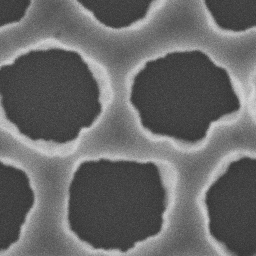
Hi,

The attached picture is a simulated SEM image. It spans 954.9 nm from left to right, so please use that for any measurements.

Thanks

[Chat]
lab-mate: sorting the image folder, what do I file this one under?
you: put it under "holes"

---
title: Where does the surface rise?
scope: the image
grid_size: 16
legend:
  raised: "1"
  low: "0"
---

0011100000111000
0111110011111100
1111111111111111
1000011111000111
0000001110000011
0000001100000001
0000001100000001
1000001110000011
1100011111000111
1111111111111111
0111100000111100
0011000000111000
0011000000011000
0011000000111000
0111100000111000
1111110011111100